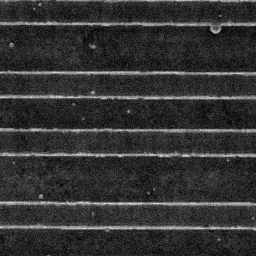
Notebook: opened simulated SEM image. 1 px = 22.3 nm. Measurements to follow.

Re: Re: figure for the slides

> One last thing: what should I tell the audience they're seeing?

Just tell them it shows lines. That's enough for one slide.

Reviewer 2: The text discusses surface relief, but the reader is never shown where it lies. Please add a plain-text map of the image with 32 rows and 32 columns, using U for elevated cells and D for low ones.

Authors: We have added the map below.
UUUUUUUUUUUUUUUUUUUUUUUUUUUUUUUU
UUUUUUUUUUUUUUUUUUUUUUUUUUUUUUUU
UUUUUUUUUUUUUUUUUUUUUUUUUUUUUUUU
DDDDDDDDDDDDDDDDDDDDDDDDDDUUDDDD
DDDDDDDDDDDDDDDDDDDDDDDDDDDDDDDD
DDDDDDDDDDDDDDDDDDDDDDDDDDDDDDDD
DDDDDDDDDDDDDDDDDDDDDDDDDDDDDDDD
DDDDDDDDDDDDDDDDDDDDDDDDDDDDDDDD
DDDDDDDDDDDDDDDDDDDDDDDDDDDDDDDD
UUUUUUUUUUUUUUUUUUUUUUUUUUUUUUUU
UUUUUUUUUUUUUUUUUUUUUUUUUUUUUUUU
UUUUUUUUUUUUUUUUUUUUUUUUUUUUUUUU
DDDDDDDDDDDDDDDDDDDDDDDDDDDDDDDD
DDDDDDDDDDDDDDDDDDDDDDDDDDDDDDDD
DDDDDDDDDDDDDDDDDDDDDDDDDDDDDDDD
DDDDDDDDDDDDDDDDDDDDDDDDDDDDDDDD
UUUUUUUUUUUUUUUUUUUUUUUUUUUUUUUU
UUUUUUUUUUUUUUUUUUUUUUUUUUUUUUUU
UUUUUUUUUUUUUUUUUUUUUUUUUUUUUUUU
DDDDDDDDDDDDDDDDDDDDDDDDDDDDDDDD
DDDDDDDDDDDDDDDDDDDDDDDDDDDDDDDD
DDDDDDDDDDDDDDDDDDDDDDDDDDDDDDDD
DDDDDDDDDDDDDDDDDDDDDDDDDDDDDDDD
DDDDDDDDDDDDDDDDDDDDDDDDDDDDDDDD
DDDDDDDDDDDDDDDDDDDDDDDDDDDDDDDD
UUUUUUUUUUUUUUUUUUUUUUUUUUUUUDDD
UUUUUUUUUUUUUUUUUUUUUUUUUUUUUUUU
UUUUUUUUUUUUUUUUUUUUUUUUUUUUUUUU
DDDDDDDDDDDDUUUUUUUUUUUUUUUUUUUU
DDDDDDDDDDDDDDDDDDDDDDDDDDDDDDDD
DDDDDDDDDDDDDDDDDDDDDDDDDDDDDDDD
DDDDDDDDDDDDDDDDDDDDDDDDDDDDDDDD